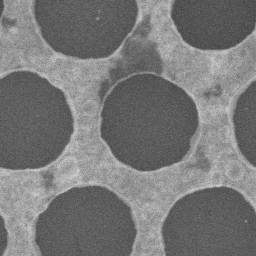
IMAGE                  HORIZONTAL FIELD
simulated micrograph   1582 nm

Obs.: holes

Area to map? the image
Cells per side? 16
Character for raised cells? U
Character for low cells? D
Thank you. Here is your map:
UUDDDDDDDUUDDDDD
UUDDDDDDUUUDDDDD
UUUDDDDDUUUUDDDU
UUUUDDDUUUUUUUUU
UDUUUUUUUUUUUUUU
DDDDUUUDDDDUUUUD
DDDDUUDDDDDDUUUD
DDDDDUDDDDDDUUUD
DDDDUUDDDDDDUUUD
DDDDUUUDDDDDUUUD
DDUUUUUUDDUUUUUU
UUUUUUUUUUUUUUUU
UUUDDDDDUUUDDDDU
UUDDDDDDUUDDDDDD
UUDDDDDDDUDDDDDD
UUDDDDDDUUDDDDDD